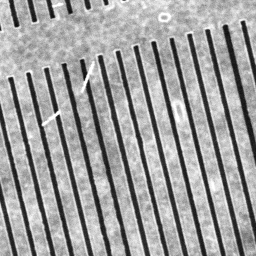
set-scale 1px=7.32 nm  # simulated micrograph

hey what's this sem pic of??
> parallel lines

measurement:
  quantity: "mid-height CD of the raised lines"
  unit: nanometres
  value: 93.4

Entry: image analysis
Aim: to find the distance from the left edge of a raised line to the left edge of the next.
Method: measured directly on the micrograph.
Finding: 135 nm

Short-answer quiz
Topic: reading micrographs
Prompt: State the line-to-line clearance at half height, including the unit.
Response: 42.7 nm